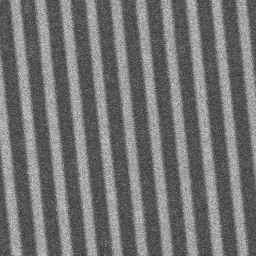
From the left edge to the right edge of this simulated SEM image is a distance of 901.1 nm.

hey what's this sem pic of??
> parallel lines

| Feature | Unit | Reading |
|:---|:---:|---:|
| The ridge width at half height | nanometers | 27.5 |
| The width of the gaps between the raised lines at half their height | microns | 0.0622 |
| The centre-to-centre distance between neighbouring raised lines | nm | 88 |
